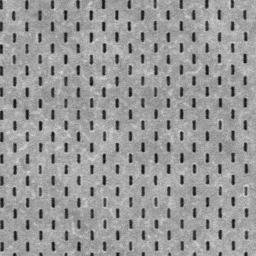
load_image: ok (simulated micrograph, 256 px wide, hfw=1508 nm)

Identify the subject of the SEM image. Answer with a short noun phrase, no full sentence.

a regular array of holes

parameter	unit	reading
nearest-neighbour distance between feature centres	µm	0.097